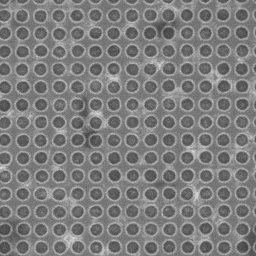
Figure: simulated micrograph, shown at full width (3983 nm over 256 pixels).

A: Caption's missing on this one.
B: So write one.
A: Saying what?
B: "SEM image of a regular array of holes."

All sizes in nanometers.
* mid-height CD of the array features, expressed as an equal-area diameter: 196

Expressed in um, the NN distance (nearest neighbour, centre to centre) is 0.273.